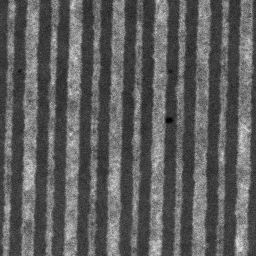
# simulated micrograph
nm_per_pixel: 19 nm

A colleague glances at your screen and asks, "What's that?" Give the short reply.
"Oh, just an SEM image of parallel lines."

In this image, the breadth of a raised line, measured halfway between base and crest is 264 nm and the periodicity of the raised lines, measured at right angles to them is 406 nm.